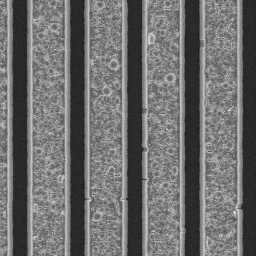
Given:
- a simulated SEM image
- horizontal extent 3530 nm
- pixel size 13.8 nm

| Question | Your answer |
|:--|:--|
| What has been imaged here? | parallel lines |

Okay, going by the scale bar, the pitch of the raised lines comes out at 790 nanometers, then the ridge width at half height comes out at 512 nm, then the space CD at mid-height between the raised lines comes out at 20.4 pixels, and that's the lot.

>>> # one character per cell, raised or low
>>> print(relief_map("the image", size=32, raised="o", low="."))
o...oooo...oooo...ooooo..ooooo..
o...oooo...oooo...ooooo..ooooo..
o...oooo...oooo...ooooo..ooooo..
o...oooo...oooo...ooooo..ooooo..
o...oooo...oooo...ooooo..ooooo..
o...oooo...oooo...ooooo..ooooo..
o...oooo...oooo...ooooo..ooooo..
o...oooo...oooo...ooooo..ooooo..
o...oooo...oooo...ooooo..ooooo..
o...oooo...oooo...ooooo..ooooo..
o...oooo...oooo...ooooo..ooooo..
o...oooo...ooooo..ooooo..ooooo..
o...oooo...oooo...ooooo..ooooo..
o...oooo...oooo...ooooo..ooooo..
o...oooo...ooooo..ooooo..ooooo..
o...oooo...oooo...ooooo..ooooo..
o...oooo...oooo...ooooo..ooooo..
o...oooo...oooo...ooooo..ooooo..
o...oooo...oooo...ooooo..ooooo..
o...oooo...oooo...ooooo..ooooo..
o...oooo...oooo...ooooo..ooooo..
o...oooo...oooo...ooooo..ooooo..
o...oooo...oooo...ooooo..ooooo..
o...oooo...oooo...ooooo..ooooo..
o...oooo...oooo...ooooo..ooooo..
o...oooo...ooooo..ooooo..ooooo..
o...oooo...ooooo..ooooo..ooooo..
o...oooo...oooo...ooooo..ooooo..
o...oooo...ooooo..ooooo..ooooo..
o...oooo...oooo...ooooo..ooooo..
o...oooo...oooo...ooooo..ooooo..
o...oooo...oooo...ooooo..ooooo..